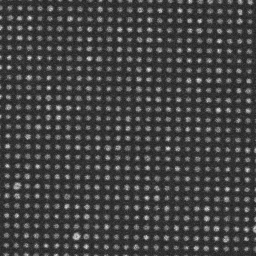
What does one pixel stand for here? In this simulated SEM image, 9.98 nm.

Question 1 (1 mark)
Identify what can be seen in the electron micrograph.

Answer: a regular array of raised bodies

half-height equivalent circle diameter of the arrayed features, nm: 45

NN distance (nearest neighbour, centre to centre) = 95.8 nanometers